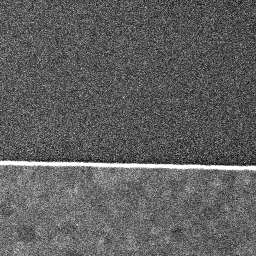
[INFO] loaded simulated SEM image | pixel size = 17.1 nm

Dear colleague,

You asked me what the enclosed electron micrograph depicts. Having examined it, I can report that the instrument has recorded one or a few lines or trenches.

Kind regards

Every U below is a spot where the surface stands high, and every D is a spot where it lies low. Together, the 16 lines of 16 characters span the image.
DDDDDDDDDDDDDDDD
DDDDDDDDDDDDDDDD
DDDDDDDDDDDDDDDD
DDDDDDDDDDDDDDDD
DDDDDDDDDDDDDDDD
DDDDDDDDDDDDDDDD
DDDDDDDDDDDDDDDD
DDDDDDDDDDDDDDDD
DDDDDDDDDDDDDDDD
DDDDDDDDDDDDDDDD
UUUUUUUUUUUUUUUU
UUUUUUUUUUUUUUUU
UUUUUUUUUUUUUUUU
UUUUUUUUUUUUUUUU
UUUUUUUUUUUUUUUU
UUUUUUUUUUUUUUUU